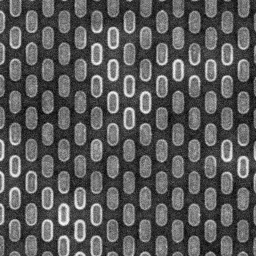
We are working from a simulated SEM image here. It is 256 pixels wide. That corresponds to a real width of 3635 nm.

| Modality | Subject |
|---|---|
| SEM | groups of lines, slits or small figures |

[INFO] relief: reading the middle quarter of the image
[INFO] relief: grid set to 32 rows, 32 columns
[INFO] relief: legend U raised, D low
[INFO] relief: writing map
DDDUUDDDDDDUUDDDDDDUUUDDDDDDUUDD
DDDUUDDDDDDUUDDDDDDUUUDDDDDDUUDD
DDDUUDDDDDDUUDDDDDDUUUDDDDDUUUDD
UDDUUDDUUDDDUDDDUDDDUDDDUDDDUUDD
UDDDDDDUUDDDDDDUUDDDDDDUUUDDDDDU
UDDDDDDUUDDDDDDUUDDDDDDUUUDDDDDU
UDDDDDDUUDDDDDDUUDDDDDDUUUDDDDDU
UDDUUDDUUDDUUDDDUDDDUDDUUUDUUUDU
DDDUUDDDDDDUUDDDDDDUUDDDDDDUUUDD
DDDUUDDDDDDUUDDDDDDUUDDDDDDUUUDD
DDDUUDDDDDDUUDDDDDDUUUDDDDDUUUDD
UDDUUDDUUDDUUDDDUDDDUDDUUUDUUUDD
UDDDDDDUUDDDDDDUUDDDDDDUUUDDDDDU
UDDDDDDUUDDDDDDUUDDDDDDUUUDDDDDU
UDDDDDDUUDDDDDDUUDDDDDDUUUDDDDDU
UDDUUDDUUDDUUDDUUDDUUDDUUUDUUUDU
DDDUUDDDDDDUUDDDDDDUUUDDDDDUUUDD
DDDUUDDDDDDUUDDDDDDUUUDDDDDUUUDD
DDDUUDDDDDDUUDDDDDDUUUDDDDDUUUDD
UDDUUDDUUDDUUDDUUDDUUUDUUDDUUUDD
UDDDDDDUUDDDDDDUUDDDDDDUUUDDDDDU
UDDDDDDUUDDDDDDUUDDDDDDUUUDDDDDU
UDDDDDDUUDDDDDDUUDDDDDDUUUDDDDDU
UDDUUDDUUDDUUDDUUDDUUDDUUUDUUUDU
DDDUUDDDDDDUUDDDDDDUUUDDDDDUUUDD
DDDUUDDDDDDUUDDDDDDUUUDDDDDUUUDD
DDDUUDDDDDDUUDDDDDDUUUDDDDDUUUDD
UDDUUDDUUDDUUDDUUDDUUUDUUDDUUUDD
UDDDDDDUUDDDDDDUUDDDDDDUUUDDDDDU
UDDDDDDUUDDDDDDUUDDDDDDUUUDDDDDU
UDDDDDDUUDDDDDDUUDDDDDDUUUDDDDDU
UDDUUDDUUDDUUDDUUDDUUDDUUUDUUDDU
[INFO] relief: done